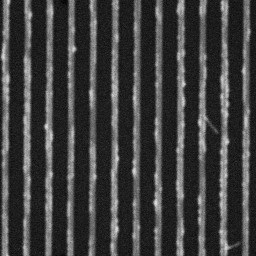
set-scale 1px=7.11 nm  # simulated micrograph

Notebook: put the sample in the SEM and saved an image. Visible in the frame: parallel lines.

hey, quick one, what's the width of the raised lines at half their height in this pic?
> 36.5 nm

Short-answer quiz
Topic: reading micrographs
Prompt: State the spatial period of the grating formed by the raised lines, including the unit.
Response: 156 nm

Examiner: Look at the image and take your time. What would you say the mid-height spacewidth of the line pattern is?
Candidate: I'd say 16.8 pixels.